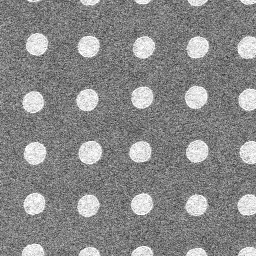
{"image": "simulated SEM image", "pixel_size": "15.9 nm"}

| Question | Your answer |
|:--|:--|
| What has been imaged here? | a regular array of raised bodies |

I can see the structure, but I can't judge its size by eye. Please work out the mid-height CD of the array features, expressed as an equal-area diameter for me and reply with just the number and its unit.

333 nanometers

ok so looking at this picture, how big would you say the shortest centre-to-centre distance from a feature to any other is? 809 nm